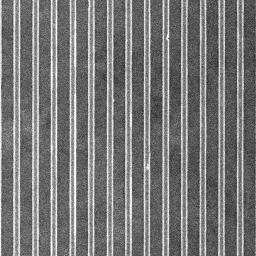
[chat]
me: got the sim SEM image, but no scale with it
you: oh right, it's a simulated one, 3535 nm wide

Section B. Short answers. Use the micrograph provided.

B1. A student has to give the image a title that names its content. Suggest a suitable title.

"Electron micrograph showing parallel lines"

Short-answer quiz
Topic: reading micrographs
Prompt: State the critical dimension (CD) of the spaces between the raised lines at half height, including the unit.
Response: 0.176 um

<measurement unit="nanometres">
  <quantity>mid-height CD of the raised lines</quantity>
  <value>77.7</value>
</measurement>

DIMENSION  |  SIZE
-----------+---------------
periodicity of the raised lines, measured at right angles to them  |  18.6 pixels